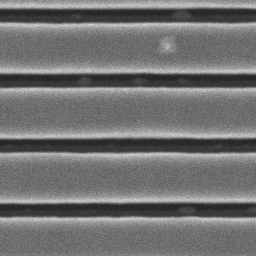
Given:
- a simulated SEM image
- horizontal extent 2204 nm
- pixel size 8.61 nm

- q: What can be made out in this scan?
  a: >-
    lines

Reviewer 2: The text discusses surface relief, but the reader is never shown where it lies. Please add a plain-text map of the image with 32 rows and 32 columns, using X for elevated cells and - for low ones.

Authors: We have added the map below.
XXXXXXXXXXXXXXXXXXXXXXXXXXXXXXXX
--------------------------------
--------------------------------
XXXXXXXXXXXXXXXXXXXXXXXXXXXXXXXX
XXXXXXXXXXXXXXXXXXXXXXXXXXXXXXXX
XXXXXXXXXXXXXXXXXXXXXXXXXXXXXXXX
XXXXXXXXXXXXXXXXXXXXXXXXXXXXXXXX
XXXXXXXXXXXXXXXXXXXXXXXXXXXXXXXX
XXXXXXXXXXXXXXXXXXXXXXXXXXXXXXXX
--------------------------------
--------------------------------
XXXXXXXXXXXXXXXXXXXXXXXXXXXXXXXX
XXXXXXXXXXXXXXXXXXXXXXXXXXXXXXXX
XXXXXXXXXXXXXXXXXXXXXXXXXXXXXXXX
XXXXXXXXXXXXXXXXXXXXXXXXXXXXXXXX
XXXXXXXXXXXXXXXXXXXXXXXXXXXXXXXX
XXXXXXXXXXXXXXXXXXXXXXXXXXXXXXXX
--------------------------------
--------------------------------
XXXXXXXXXXXXXXXXXXXXXXXXXXXXXXXX
XXXXXXXXXXXXXXXXXXXXXXXXXXXXXXXX
XXXXXXXXXXXXXXXXXXXXXXXXXXXXXXXX
XXXXXXXXXXXXXXXXXXXXXXXXXXXXXXXX
XXXXXXXXXXXXXXXXXXXXXXXXXXXXXXXX
XXXXXXXXXXXXXXXXXXXXXXXXXXXXXXXX
--------------------------------
--------------------------------
XXXXXXXXXXXXXXXXXXXXXXXXXXXXXXXX
XXXXXXXXXXXXXXXXXXXXXXXXXXXXXXXX
XXXXXXXXXXXXXXXXXXXXXXXXXXXXXXXX
XXXXXXXXXXXXXXXXXXXXXXXXXXXXXXXX
XXXXXXXXXXXXXXXXXXXXXXXXXXXXXXXX